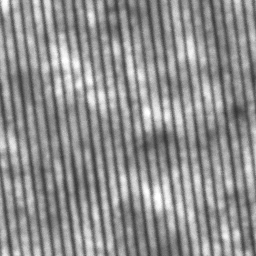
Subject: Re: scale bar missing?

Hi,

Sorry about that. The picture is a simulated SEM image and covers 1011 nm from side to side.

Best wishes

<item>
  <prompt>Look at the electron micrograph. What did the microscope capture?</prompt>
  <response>parallel lines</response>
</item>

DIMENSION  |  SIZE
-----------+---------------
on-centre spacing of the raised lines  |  41.4 nanometres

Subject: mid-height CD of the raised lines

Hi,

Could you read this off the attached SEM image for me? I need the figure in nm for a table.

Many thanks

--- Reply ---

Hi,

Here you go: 28.3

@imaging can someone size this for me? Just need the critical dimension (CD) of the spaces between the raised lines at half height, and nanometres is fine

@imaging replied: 14.2